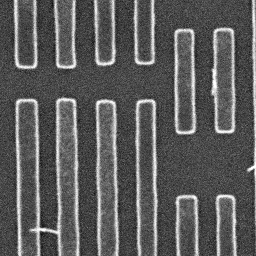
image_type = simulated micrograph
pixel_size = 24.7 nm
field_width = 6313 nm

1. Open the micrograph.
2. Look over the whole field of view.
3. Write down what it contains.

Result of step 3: wiring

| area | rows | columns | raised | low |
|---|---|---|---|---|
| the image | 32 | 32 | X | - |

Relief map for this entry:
--XX---XX---XX---XX-------------
--XX---XX---XX---XX-------------
--XX---XX---XX---XX-------------
--XX---XX---XX---XX-------------
--XX---XX---XX---XX---XX---XX---
--XX---XX---XX---XX---XX---XX---
--XX---XX---XX---XX---XX---XX---
--XX---XX---XX---XX---XX---XX---
----------------------XX---XX---
----------------------XX---XX---
----------------------XX---XX---
----------------------XX---XX---
--------X-------------XX---XX---
--XXX--XX---XX---XX---XX---XX---
--XXX--XX---XX---XX---XX---XX---
--XXX--XX---XX---XX---XX---XX---
--XXX--XXX--XX---XX---XX--------
--XXX--XXX--XX---XX-------------
--XXX--XXX--XX---XX-------------
--XXX--XXX--XX---XX-------------
--XXX--XXX--XX---XX-------------
--XXX--XXX--XX---XX-------------
--XXX--XXX--XXX--XX-------------
--XXX--XXX--XXX--XX-------------
--XXX--XXX--XXX--XX-------------
--XXX--XXX--XXX--XXX--XXX--XX---
--XXX--XXX--XXX--XX---XXX--XX---
--XXX--XXX--XXX--XX---XXX--XX---
--XXX--XXX--XXX--XX---XXX--XX---
--XXX--XXX--XXX--XX---XXX--XX---
--XXX--XXX--XXX--XX---XXX--XX---
--XXX--XXX--XXX--XX---XXX--XX---